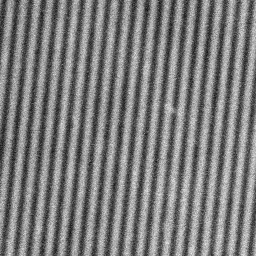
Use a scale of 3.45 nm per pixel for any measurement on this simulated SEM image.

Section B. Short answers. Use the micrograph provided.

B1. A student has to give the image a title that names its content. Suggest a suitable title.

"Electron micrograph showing parallel lines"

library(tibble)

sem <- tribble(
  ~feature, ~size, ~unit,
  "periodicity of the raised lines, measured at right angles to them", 44.6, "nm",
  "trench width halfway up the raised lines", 24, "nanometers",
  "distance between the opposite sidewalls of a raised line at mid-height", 20.2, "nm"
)